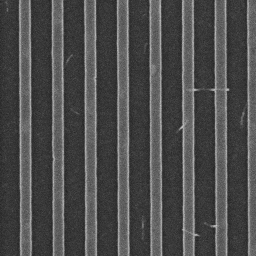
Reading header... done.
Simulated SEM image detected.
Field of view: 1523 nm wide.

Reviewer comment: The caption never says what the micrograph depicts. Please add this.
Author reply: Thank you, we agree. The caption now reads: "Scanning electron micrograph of parallel lines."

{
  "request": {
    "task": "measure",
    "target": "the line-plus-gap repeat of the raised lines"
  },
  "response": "194 nm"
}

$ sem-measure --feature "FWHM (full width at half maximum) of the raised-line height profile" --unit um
0.0624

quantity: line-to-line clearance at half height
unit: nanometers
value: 129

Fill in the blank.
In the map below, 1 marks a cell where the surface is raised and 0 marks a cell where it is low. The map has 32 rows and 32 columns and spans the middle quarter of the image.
00000111000000110000001100000011
00000111000000110000001100000011
00000111000000110000001100000011
00000111000000110000001100000011
00000111000000110000001100000011
00000111000000110000001100000011
00000111000000110000001100000011
00000111000000110000001100000011
00000111000000110000001100000011
00000111000000110000001100000011
00000111000000110000001100000011
00000111000000110000001100000011
00000111000000110000001100000011
00000111000000110000001100000011
00000111000000110000001100000011
00000111000001110000001100000011
00000111000000110000001100000011
00000111000000110000001100000011
00000111000000110000001100000011
00000111000000110000001100000011
00000111000000110000001100000011
00000111000001110000001100000011
00000111000000110000001100000011
00000111000000110000001100000011
00000111000000110000001100000011
00000111000000110000001100000011
00000111000000110000001100000011
00000111000000110000001100000011
00000111000000110000001100000011
00000111000000110000001100000011
00000111000000110000001100000011
00000111000000110000001100000011